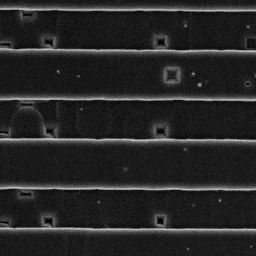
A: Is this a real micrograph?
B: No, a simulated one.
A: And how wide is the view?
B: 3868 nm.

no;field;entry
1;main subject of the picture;wiring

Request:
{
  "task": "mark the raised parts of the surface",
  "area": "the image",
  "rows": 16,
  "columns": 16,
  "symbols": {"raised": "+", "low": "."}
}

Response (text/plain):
++++++++++++++++
................
................
++++++++++++++++
++++++++++++++++
++++++++++++++++
................
................
................
++++++++++++++++
++++++++++++++++
++++++++++++++++
................
................
++++++++++++++++
++++++++++++++++